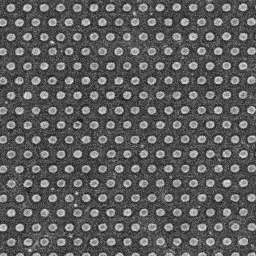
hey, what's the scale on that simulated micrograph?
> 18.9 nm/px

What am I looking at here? a regular array of raised bodies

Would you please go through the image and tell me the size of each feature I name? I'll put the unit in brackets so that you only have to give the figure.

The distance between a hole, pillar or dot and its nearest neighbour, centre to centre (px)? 16.4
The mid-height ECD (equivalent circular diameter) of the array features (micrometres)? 0.138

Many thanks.